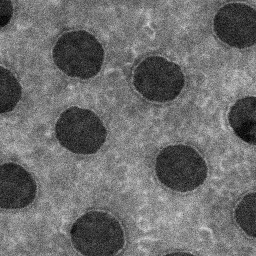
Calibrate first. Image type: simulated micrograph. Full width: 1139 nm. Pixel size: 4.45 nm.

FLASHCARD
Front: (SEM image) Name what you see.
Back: raised bodies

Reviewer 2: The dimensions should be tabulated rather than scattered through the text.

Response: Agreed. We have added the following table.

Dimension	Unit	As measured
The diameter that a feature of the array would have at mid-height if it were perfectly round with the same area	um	0.231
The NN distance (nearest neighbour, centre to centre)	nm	355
